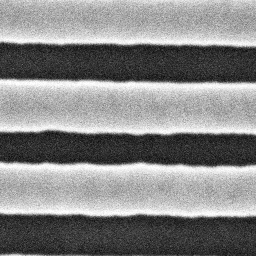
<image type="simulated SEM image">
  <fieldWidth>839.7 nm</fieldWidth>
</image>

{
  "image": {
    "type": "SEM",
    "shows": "lines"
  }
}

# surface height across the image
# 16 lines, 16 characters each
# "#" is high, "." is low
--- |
################
################
################
................
................
################
################
################
................
................
################
################
################
............#...
................
................